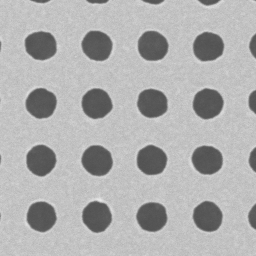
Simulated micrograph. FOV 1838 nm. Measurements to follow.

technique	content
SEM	a regular array of holes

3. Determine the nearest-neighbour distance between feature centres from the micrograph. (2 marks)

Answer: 399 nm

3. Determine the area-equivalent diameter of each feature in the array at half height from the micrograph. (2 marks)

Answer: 218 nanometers